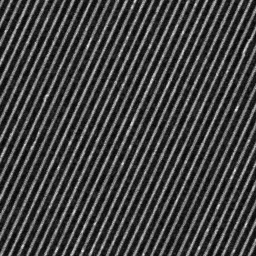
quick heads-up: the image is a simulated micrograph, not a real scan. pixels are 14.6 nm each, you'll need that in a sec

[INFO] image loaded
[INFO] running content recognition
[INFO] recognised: parallel lines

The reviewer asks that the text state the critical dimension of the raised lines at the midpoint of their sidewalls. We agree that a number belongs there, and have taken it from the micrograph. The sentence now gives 1.94 pixels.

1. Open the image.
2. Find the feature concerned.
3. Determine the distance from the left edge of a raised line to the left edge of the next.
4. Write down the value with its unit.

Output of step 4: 118 nm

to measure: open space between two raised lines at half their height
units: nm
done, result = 81.1